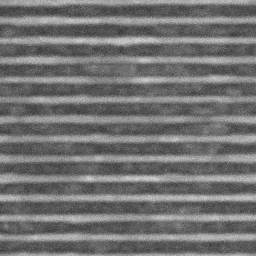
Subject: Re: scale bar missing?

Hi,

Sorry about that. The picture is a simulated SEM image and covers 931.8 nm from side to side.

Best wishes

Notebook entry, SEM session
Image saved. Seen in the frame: parallel lines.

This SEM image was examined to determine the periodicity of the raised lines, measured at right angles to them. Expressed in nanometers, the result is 71.7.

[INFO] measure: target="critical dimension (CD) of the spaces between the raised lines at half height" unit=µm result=0.0555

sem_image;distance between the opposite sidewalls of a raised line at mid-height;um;0.0164